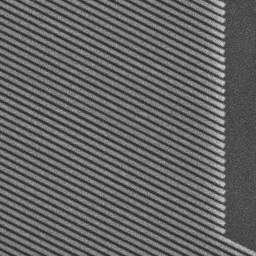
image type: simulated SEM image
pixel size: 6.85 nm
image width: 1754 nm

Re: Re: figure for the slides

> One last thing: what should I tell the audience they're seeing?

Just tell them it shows parallel lines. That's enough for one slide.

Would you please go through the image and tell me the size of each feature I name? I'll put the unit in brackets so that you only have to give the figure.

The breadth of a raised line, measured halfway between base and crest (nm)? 31.4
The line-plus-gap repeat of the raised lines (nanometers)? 47.9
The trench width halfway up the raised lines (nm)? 19.2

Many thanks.